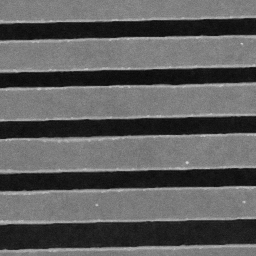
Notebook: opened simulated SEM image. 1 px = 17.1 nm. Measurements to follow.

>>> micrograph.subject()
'lines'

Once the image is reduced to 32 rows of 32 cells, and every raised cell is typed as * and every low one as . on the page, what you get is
********************************
********************************
*******************.............
................................
...........................*****
********************************
********************************
********************************
************************........
................................
..........................******
********************************
********************************
********************************
****************************....
................................
................................
********************************
********************************
********************************
********************************
*******.........................
................................
....................************
********************************
********************************
********************************
************************........
................................
................................
................................
********************************